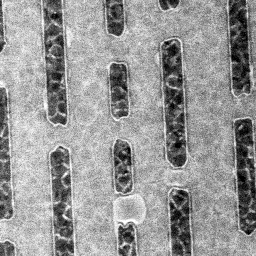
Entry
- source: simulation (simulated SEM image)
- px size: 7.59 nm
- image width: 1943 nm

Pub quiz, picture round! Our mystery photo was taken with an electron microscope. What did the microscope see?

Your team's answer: one or a few lines or trenches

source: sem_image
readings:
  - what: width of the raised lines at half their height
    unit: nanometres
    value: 154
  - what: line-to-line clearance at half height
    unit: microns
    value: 0.321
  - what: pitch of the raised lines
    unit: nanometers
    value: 460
